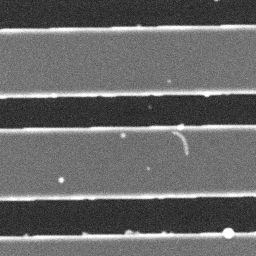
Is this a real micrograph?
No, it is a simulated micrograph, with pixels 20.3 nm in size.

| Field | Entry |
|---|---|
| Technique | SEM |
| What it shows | lines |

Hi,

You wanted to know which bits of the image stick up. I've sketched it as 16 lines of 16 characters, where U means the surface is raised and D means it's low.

DDDDDDDDDDDDDDDD
DDDDDDDDDDDDDDDD
UUUUUUUUUUUUUUUU
UUUUUUUUUUUUUUUU
UUUUUUUUUUUUUUUU
UUUUUUUUUUUUUUUU
DDDDDDDDDDDDDDDD
DDDDDDDDDDDDDDDD
UUUUUUUUUUUUUUUU
UUUUUUUUUUUUUUUU
UUUUUUUUUUUUUUUU
UUUUUUUUUUUUUUUU
DDDDDDDDDDDDDDDD
DDDDDDDDDDDDDDDD
DDDDDDDDDDDDDDUD
UUUUUUUUUUUUUUUU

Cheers